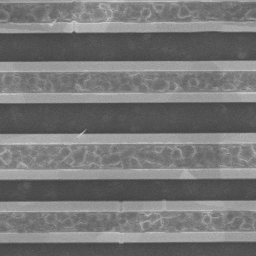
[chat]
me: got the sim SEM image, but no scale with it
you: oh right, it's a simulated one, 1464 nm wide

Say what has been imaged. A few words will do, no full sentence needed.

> one or a few lines or trenches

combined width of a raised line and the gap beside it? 69.9 pixels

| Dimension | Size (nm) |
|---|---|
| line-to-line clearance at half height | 222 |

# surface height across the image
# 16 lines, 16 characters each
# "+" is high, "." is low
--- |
++++++++++++++++
++++++++++++++++
................
................
++++++++++++++++
++++++++++++++++
................
................
................
++++++++++++++++
++++++++++++++++
................
................
++++++++++++++++
++++++++++++++++
................